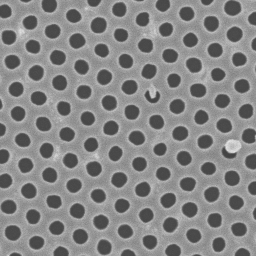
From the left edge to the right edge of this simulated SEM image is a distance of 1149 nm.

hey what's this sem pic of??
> a regular array of holes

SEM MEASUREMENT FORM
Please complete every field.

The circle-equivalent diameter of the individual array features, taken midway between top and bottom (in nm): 66.8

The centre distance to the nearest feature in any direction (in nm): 113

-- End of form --